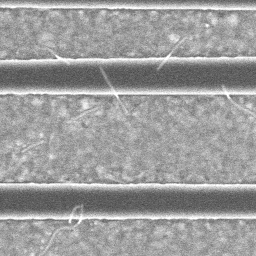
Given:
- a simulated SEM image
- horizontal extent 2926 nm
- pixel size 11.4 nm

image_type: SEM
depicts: lines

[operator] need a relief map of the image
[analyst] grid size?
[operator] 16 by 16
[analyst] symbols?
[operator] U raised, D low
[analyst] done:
DDDDDDUUUUUUUUUU
DDDDDDDDDDDDDDDD
DDDDDDDDDDDDDDDD
DDDDDDDDDDDDDDDD
UUUUUUUUUUUUUUUU
UUUUUUUUUUUUUUUU
DDDDDDDDDDDDDDDD
DDDDDDDDDDDDDDDD
DDDDDDDDDDDDDDDD
DDDDDDDDDDDDDDDD
DDDDDDDDDDDDDDDD
DUDDDDDDDDDDDDDD
UUUUUUUUUUUUUUUU
UUUUUUUUUUUUUUUU
DDDDDDDDDDDDDDDD
DDDDDDDDDDDDDDDD